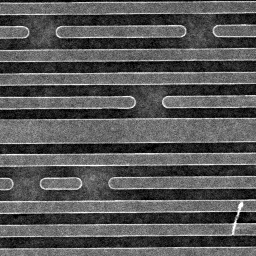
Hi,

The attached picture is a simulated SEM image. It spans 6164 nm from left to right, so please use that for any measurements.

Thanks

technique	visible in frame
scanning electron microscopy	groups of lines, slits or small figures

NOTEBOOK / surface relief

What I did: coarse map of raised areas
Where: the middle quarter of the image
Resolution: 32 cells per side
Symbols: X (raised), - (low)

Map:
--------------------------------
--------------------------------
XXXXXXXXXXXXXXXXXXXXXXXXXXXXXXXX
XXXXXXXXXXXXXXXXXXXXXXXXXXXXXXXX
XXXXXXXXXXXXXXXXXXXXXXXXXXXXXXXX
--------------------------------
--------------------------------
--------------------------------
XXXXXXXXXXXXXXXXX--------XXXXXXX
XXXXXXXXXXXXXXXXXX-------XXXXXXX
XXXXXXXXXXXXXXXXXX-------XXXXXXX
--------------------------------
--------------------------------
--------------------------------
XXXXXXXXXXXXXXXXXXXXXXXXXXXXXXXX
XXXXXXXXXXXXXXXXXXXXXXXXXXXXXXXX
XXXXXXXXXXXXXXXXXXXXXXXXXXXXXXXX
XXXXXXXXXXXXXXXXXXXXXXXXXXXXXXXX
XXXXXXXXXXXXXXXXXXXXXXXXXXXXXXXX
XXXXXXXXXXXXXXXXXXXXXXXXX-------
--------------------------------
--------------------------------
-------XXXXXXXXXXXXXXXXXXXXXXXXX
XXXXXXXXXXXXXXXXXXXXXXXXXXXXXXXX
XXXXXXXXXXXXXXXXXXXXXXXXXXXXXXXX
--------------------------------
--------------------------------
--------------------------------
------------XXXXXXXXXXXXXXXXXXXX
XXXX-------XXXXXXXXXXXXXXXXXXXXX
XXXX-------XXXXXXXXXXXXXXXXXXXXX
--------------------------------